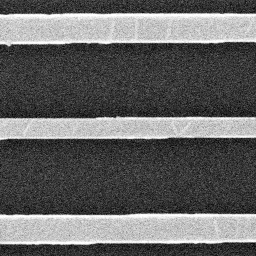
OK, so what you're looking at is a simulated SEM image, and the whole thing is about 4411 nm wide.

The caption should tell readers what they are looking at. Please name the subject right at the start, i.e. lines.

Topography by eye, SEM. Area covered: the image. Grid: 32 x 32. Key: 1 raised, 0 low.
00000000000000000000000000000000
00000000000000000000000000000000
11111111111111111111111111111111
11111111111111111111111111111111
11111111111111111111111111111111
11000000000000000000000000000000
00000000000000000000000000000000
00000000000000000000000000000000
00000000000000000000000000000000
00000000000000000000000000000000
00000000000000000000000000000000
00000000000000000000000000000000
00000000000000000000000000000000
00000000000000000000000000000000
00000000000000000000000000000000
11111111111111111111111111111111
11111111111111111111111111111111
00000000000000000000000000000000
00000000000000000000000000000000
00000000000000000000000000000000
00000000000000000000000000000000
00000000000000000000000000000000
00000000000000000000000000000000
00000000000000000000000000000000
00000000000000000000000000000000
00000000000000000000000000000000
00000000000000000000000000000000
11111111111111111111111111111111
11111111111111111111111111111111
11111111111111111111111111111111
00000000000000000000000000000000
00000000000000000000000000000000